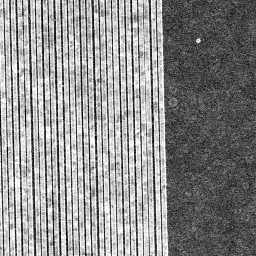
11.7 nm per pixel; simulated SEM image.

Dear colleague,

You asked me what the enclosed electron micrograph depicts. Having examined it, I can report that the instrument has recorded parallel lines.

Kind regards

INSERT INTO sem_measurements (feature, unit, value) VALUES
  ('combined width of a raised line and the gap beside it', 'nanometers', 74.3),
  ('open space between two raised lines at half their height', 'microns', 0.0322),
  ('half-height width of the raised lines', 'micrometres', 0.0454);